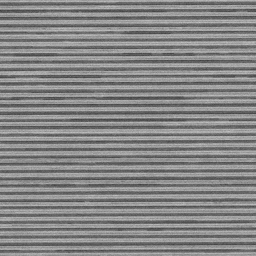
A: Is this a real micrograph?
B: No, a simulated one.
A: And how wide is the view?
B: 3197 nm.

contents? parallel lines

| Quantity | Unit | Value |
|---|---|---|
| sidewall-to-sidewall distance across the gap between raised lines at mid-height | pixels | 4.37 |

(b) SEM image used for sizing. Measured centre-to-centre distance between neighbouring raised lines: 90.9 nanometers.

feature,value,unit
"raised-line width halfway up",43.7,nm